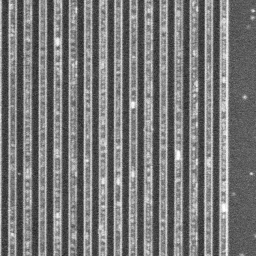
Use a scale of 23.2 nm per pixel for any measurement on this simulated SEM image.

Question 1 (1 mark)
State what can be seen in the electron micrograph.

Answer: parallel lines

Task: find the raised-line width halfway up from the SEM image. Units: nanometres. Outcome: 156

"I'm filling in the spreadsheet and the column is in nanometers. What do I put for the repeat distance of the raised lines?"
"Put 350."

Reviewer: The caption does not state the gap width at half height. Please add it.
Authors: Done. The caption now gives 200 nanometers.